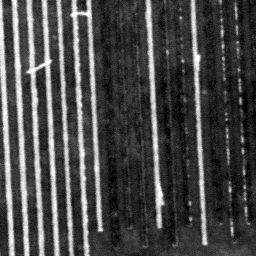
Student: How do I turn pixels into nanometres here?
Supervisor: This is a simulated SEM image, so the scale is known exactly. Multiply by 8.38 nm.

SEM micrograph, parallel lines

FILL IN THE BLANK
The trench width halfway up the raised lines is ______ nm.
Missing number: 95.1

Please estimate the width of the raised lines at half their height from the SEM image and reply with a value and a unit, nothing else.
29.3 nm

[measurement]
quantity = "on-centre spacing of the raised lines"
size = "125 nanometers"